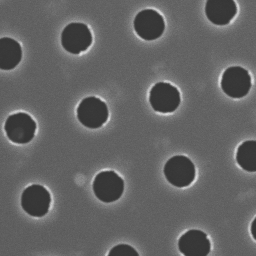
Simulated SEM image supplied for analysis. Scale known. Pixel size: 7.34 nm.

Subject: a regular array of holes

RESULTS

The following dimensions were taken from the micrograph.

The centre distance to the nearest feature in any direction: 0.539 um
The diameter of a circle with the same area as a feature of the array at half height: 227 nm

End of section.